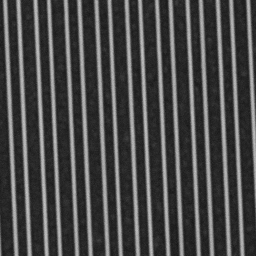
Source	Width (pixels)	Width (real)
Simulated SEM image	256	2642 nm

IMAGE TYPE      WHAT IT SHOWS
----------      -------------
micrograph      parallel lines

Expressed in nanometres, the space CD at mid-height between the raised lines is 108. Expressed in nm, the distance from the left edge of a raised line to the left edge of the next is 156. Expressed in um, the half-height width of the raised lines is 0.0361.